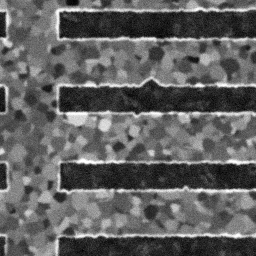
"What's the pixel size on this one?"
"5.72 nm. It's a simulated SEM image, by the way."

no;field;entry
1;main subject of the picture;one or a few lines or trenches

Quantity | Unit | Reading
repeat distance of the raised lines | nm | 432